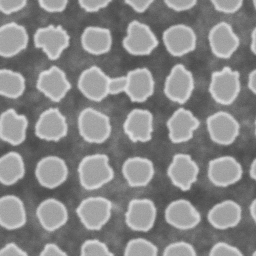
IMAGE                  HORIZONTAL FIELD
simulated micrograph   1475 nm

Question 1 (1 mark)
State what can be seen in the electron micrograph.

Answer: a regular array of raised bodies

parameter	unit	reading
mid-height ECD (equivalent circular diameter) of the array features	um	0.179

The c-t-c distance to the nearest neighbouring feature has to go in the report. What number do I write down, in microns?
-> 0.242